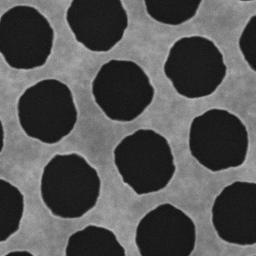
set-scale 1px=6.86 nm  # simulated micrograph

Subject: holes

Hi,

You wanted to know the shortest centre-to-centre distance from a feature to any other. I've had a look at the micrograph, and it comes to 0.524 µm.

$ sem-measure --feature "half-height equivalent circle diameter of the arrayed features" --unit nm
417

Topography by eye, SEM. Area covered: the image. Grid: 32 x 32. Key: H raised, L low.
HHHHHHHHHLLLLLLHHHLLLLLLLHHHHHHH
HLLLLHHHLLLLLLLLHHLLLLLLLHHHHHHH
LLLLLLHHLLLLLLLLHHHLLLLHHHHHHHHL
LLLLLLHHHLLLLLLLHHHHHHHHHHHHHHHL
LLLLLLLHHLLLLLLHHHHHHHHHHHHHHHLL
LLLLLLLHHHLLLLHHHHHHHHLLLLLHHHLL
LLLLLLHHHHHHHHHHHHHHHLLLLLLLHHLL
HLLLLLHHHHHHHHLHHHHHHLLLLLLLHHHL
HHLLHHHHHHHHHLLLLLHHHLLLLLLLHHHL
HHHHHHHHHHHHLLLLLLHHHLLLLLLLHHHH
HHHHLLLLHHHHLLLLLLLHHHLLLLLHHHHH
HHHLLLLLLHHHLLLLLLLHHHLLLLLHHHHH
HHLLLLLLLHHHLLLLLLLHHHHHHHHHHHHH
HHLLLLLLLHHHHLLLLLHHHHHHHHHHHHHH
HHLLLLLLLLHHHLLLLHHHHHHHHLLLLHHH
HHHLLLLLLHHHHHHHHHHHHHHHLLLLLLHH
HHHLLLLLLHHHHHHHHLLHHHHHLLLLLLLH
HHHHHLLHHHHHHHHLLLLLLHHHLLLLLLLH
HHHHHHHHHHHHHHLLLLLLLHHHLLLLLLLH
HHHHHHHLLLHHHHLLLLLLLLHHLLLLLLLH
HHHHHHLLLLLHHHLLLLLLLLHHHLLLLLHH
HHHHHLLLLLLLHHHLLLLLLLHHHHHHHHHH
HHHHHLLLLLLLHHHLLLLLLHHHHHHHHHHH
LLHHHLLLLLLLHHHHLLLLHHHHHHHHLLLL
LLLHHLLLLLLLHHHHHHHHHHHHHHHLLLLL
LLLHHHLLLLLLHHHHHHHHHHHHHHHLLLLL
LLLHHHLLLLLHHHHHHHHLLLLHHHHLLLLL
LLLHHHHHHHHHHHHHHHLLLLLLHHHLLLLL
LLHHHHHHHHHLLHHHHLLLLLLLHHHLLLLL
LHHHHHHHHLLLLLHHHLLLLLLLHHHLLLLL
HHHHHHHHLLLLLLLHHLLLLLLLHHHHHHLH
HHLHHHHHLLLLLLLLHLLLLLLLHHHHHHHH